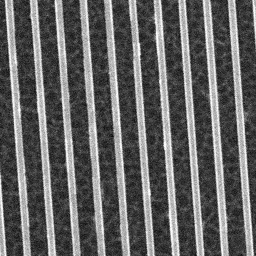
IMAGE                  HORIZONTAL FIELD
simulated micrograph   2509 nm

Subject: parallel lines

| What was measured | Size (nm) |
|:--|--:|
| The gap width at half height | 182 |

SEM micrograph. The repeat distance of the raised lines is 24.7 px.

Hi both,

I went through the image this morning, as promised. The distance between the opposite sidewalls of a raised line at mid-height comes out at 0.0574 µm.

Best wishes